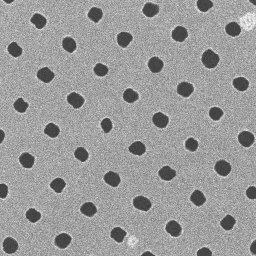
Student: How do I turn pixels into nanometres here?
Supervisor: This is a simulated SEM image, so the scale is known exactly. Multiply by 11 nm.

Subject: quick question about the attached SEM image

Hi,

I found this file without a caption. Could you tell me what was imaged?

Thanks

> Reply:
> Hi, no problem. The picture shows a regular array of holes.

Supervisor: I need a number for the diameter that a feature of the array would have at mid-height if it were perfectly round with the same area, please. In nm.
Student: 167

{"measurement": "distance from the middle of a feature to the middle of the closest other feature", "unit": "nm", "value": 423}